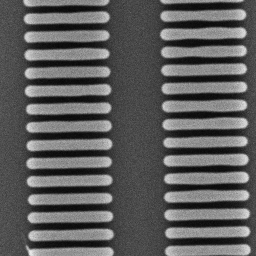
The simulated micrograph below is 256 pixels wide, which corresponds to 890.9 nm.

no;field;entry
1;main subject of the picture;groups of lines, slits or small figures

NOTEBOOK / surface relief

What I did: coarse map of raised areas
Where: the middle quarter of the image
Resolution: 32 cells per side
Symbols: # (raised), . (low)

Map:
.........................#######
###########..............#######
###########..............#######
................................
................................
###########..............#######
############.............#######
###########.....................
................................
.........................#######
############.............#######
############.............#######
................................
................................
#.#########..............#######
############.............#######
###########.....................
................................
...............................#
############.............#######
############.............#######
##..............................
................................
..#########..............#######
############.............#######
###########................###..
................................
............................####
############.............#######
############..............######
###.............................
................................